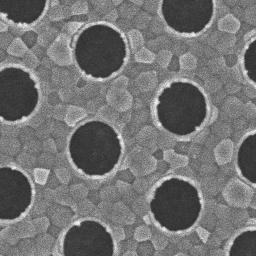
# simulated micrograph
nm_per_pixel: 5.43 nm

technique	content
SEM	holes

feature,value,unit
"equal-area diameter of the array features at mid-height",51.3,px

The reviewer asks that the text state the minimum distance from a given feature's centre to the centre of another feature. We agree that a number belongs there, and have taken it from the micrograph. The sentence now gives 520 nanometres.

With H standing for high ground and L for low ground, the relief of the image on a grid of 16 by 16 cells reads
LLLHHHHHHHLLLHHH
HHHHHHHHHHHLLHHH
HHHHHLLLHHHHHHHH
HHHHHLLLHHHHHHHL
LLHHHLLHHHHHHHHL
LLHHHHHHHHLLHHHH
LLHHHHHHHHLLLHHH
HHHHHHHHHHLLLHHH
HHHHHLLHHHHHHHHH
HHHHLLLLHHHHHHHL
HHHHHLLHHHHHHHHL
LLHHHHHHHHLLHHHH
LLHHHHHHHHLLHHHH
LHHHHHHHHHLLHHHH
HHHHLLLHHHHHHHHL
HHHHLLLHHHHHHHLL